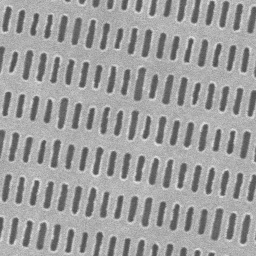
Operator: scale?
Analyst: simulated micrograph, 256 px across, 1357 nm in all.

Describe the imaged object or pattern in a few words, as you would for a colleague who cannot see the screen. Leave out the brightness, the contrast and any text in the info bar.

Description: a regular array of holes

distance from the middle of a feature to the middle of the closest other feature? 74.8 nm